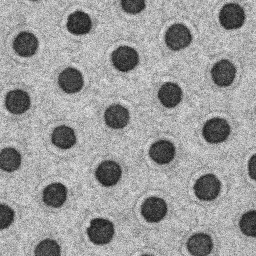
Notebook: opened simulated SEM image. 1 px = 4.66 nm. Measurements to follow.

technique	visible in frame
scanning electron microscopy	a regular array of holes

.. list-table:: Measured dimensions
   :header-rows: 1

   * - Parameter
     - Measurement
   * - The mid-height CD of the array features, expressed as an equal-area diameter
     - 134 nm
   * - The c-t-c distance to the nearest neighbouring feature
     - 268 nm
